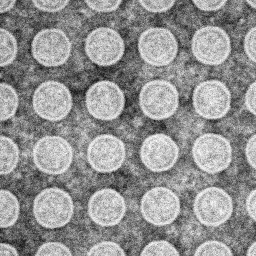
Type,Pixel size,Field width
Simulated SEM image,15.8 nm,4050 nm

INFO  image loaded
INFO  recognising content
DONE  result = a regular array of raised bodies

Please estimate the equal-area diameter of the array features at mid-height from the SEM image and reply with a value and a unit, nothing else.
572 nm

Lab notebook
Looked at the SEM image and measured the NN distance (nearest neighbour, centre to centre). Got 838 nanometers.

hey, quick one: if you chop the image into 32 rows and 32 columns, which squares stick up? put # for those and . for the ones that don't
#....###...####...###....###...#
................................
................................
................................
#....###...####...###...####...#
##..#####..####...####..#####..#
##..#####..####...####..####...#
#....###....###...###....###....
................................
................................
......#.....##.....##....##.....
##...###...####...####..####...#
##..#####..####...####..#####..#
##..#####..####...####...###...#
#....###....##.....##.....##....
................................
................................
#....###....###...###....###...#
##..#####..####...####..#####..#
##..#####..####...####..#####..#
##...####..####...####...###....
#.....#.........................
................................
................................
#....###....###...####...###...#
##..#####..####...####..#####..#
##..#####..####...####...####..#
##...###....###....##....###....
................................
................................
......#.....##.....##.....#.....
##...####..####...####...####..#